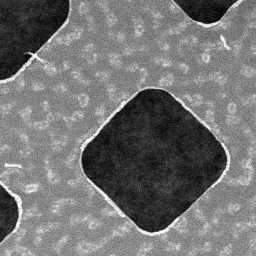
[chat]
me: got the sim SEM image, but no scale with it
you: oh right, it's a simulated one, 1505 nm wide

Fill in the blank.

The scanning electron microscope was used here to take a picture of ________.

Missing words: holes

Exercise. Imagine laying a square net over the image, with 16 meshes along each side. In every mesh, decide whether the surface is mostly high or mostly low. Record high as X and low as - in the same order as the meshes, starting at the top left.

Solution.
----XXXXXXX---XX
----XXXXXXXXXXXX
---XXXXXXXXXXXXX
--XXXXXXXXXXXXXX
-XXXXXXXXXXXXXXX
XXXXXXXXXXXXXXXX
XXXXXXXX---XXXXX
XXXXXXX-----XXXX
XXXXXX-------XXX
XXXXX---------XX
XXXXX---------XX
XXXXXX-------XXX
-XXXXXX-----XXXX
-XXXXXXX---XXXXX
-XXXXXXXX-XXXXXX
XXXXXXXXXXXXXXXX